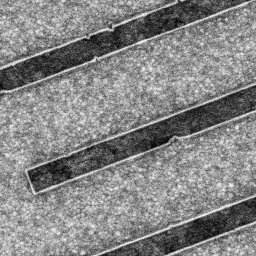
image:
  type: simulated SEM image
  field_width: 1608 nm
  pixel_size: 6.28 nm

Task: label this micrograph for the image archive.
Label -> one or a few lines or trenches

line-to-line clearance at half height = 0.495 micrometres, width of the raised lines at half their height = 0.16 um